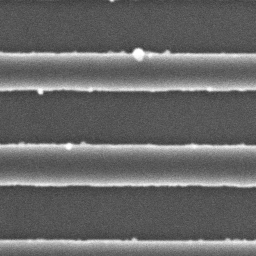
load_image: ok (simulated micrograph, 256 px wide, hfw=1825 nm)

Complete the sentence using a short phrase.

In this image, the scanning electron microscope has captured lines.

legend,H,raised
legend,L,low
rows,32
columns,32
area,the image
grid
LLLLLLLLLLLLLLLLLLLLLLLLLLLLLLLL
LLLLLLLLLLLLLLLLLLLLLLLLLLLLLLLL
LLLLLLLLLLLLLLLLLLLLLLLLLLLLLLLL
LLLLLLLLLLLLLLLLLLLLLLLLLLLLLLLL
LLLLLLLLLLLLLLLLLLLLLLLLLLLLLLLL
LLLLLLLLLLLLLLLLLLLLLLLLLLLLLLLL
LLLLLLLLLLLLLLLLLHLLLLLLLLLLLLLL
HHHHHHHHHHHHHHHHHHHHHHHHHHHHHHHH
HHHHHHHHHHHHHHHHHHHHHHHHHHHHHHHH
HHHHHHHHHHHHHHHHHHHHHHHHHHHHHHHH
HHHHHHHHHHHHHHHHHHHHHHHHHHHHHHHH
LLLLLLLLLLLLLLLLLLLLLLLLLLLLLLLL
LLLLLLLLLLLLLLLLLLLLLLLLLLLLLLLL
LLLLLLLLLLLLLLLLLLLLLLLLLLLLLLLL
LLLLLLLLLLLLLLLLLLLLLLLLLLLLLLLL
LLLLLLLLLLLLLLLLLLLLLLLLLLLLLLLL
LLLLLLLLLLLLLLLLLLLLLLLLLLLLLLLL
LLLLLLLLLLLLLLLLLLLLLLLLLLLLLLLL
HHHHHHHHHHHHHHHHHHHHHHHHHHHHHHHH
HHHHHHHHHHHHHHHHHHHHHHHHHHHHHHHH
HHHHHHHHHHHHHHHHHHHHHHHHHHHHHHHH
HHHHHHHHHHHHHHHHHHHHHHHHHHHHHHHH
HHHHHHHHHHHHHHHHHHHHHHHHHHHHHHHH
LLLLLLLLLLLLLLLLLLLLLLLLLLLLLLLL
LLLLLLLLLLLLLLLLLLLLLLLLLLLLLLLL
LLLLLLLLLLLLLLLLLLLLLLLLLLLLLLLL
LLLLLLLLLLLLLLLLLLLLLLLLLLLLLLLL
LLLLLLLLLLLLLLLLLLLLLLLLLLLLLLLL
LLLLLLLLLLLLLLLLLLLLLLLLLLLLLLLL
LLLLLLLLLLLLLLLLLLLLLLLLLLLLLLLL
HHHHHHHHHHHHHHHHHHHHHHHHHHHHHHHH
HHHHHHHHHHHHHHHHHHHHHHHHHHHHHHHH